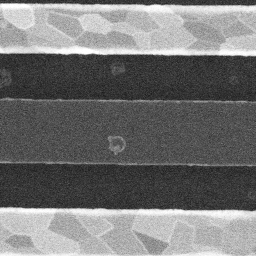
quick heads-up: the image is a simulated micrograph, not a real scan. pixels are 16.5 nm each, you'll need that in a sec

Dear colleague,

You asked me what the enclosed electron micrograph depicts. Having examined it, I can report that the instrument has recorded lines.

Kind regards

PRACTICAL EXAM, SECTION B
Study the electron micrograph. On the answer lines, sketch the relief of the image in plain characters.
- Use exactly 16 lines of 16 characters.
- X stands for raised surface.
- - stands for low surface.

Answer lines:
XXXXXXXXXXXXXXXX
XXXXXXXXXXXXXXXX
XXXXXXXXXXXXXXXX
----------------
----------------
----------------
XXXXXXXXXXXXXXXX
XXXXXXXXXXXXXXXX
XXXXXXXXXXXXXXXX
XXXXXXXXXXXXXXXX
----------------
----------------
----------------
XXXXXXXXXXXXXXXX
XXXXXXXXXXXXXXXX
XXXXXXXXXXXXXXXX